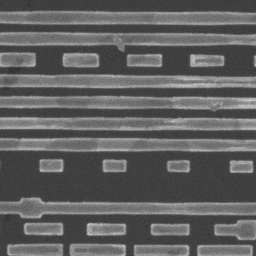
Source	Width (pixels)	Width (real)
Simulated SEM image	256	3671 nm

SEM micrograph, wiring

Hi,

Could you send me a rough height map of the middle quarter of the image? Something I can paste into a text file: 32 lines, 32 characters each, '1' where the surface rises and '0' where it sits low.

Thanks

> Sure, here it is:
11111111000000000000000000000000
00000000000000000000000000000000
00000000000000000000000000000000
11111111111111111111111111110011
11111111111111111111111111100000
11111111111111111111111111111000
00000000000000000000000000000000
00000000000000000000000000000000
11111111111111111110000000000000
11111111111111111111111111111111
11111111111111111111111111111111
00000000000000000000000000000000
00000000000000000000000000000000
00000000000000000000000000000000
11111111111111111111111110001111
11111111111111111111111110000111
00000000000000000000000000000000
00000000000000000000000000000000
00000000000000000000000000000000
11111111111111111111111111111111
11111111111111111111111111111111
11111111111111111111111110011111
00000000000000000000000000000000
00000000000000000000000000000000
00000000001111100000000000111110
00000000001111100000000000111110
00000000001111100000000000111110
00000000000000000000000000000000
00000000000000000000000000000000
00000000000000000000000000000000
00000000000000000000000000000000
00000000000000000000000000000000